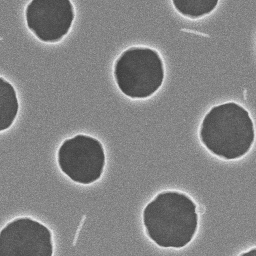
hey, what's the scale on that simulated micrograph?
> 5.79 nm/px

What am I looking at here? holes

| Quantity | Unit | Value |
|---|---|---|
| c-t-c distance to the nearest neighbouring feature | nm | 604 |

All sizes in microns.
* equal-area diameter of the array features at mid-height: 0.304